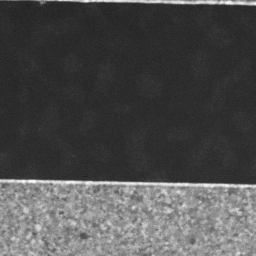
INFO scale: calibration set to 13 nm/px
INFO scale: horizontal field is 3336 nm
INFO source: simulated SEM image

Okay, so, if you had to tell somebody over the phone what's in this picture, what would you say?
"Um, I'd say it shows one or a few lines or trenches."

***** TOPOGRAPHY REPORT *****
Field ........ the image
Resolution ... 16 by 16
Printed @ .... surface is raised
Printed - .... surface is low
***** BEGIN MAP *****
----------------
----------------
----------------
----------------
----------------
----------------
----------------
----------------
----------------
----------------
----------------
@@@@@@@@-@------
@@@@@@@@@@@@@@@@
@@@@@@@@@@@@@@@@
@@@@@@@@@@@@@@@@
@@@@@@@@@@@@@@@@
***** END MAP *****